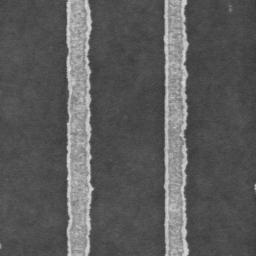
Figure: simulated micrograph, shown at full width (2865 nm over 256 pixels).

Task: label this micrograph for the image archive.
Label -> one or a few lines or trenches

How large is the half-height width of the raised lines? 0.208 µm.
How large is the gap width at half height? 878 nm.